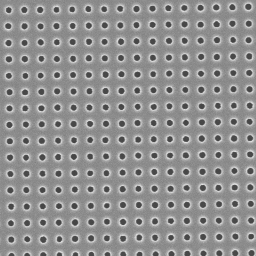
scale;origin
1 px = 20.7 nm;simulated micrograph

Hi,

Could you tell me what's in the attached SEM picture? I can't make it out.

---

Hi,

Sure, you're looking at a regular array of holes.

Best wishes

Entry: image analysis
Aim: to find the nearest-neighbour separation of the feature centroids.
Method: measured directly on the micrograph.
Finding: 327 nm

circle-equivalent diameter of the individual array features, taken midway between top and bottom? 128 nm